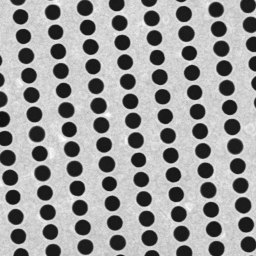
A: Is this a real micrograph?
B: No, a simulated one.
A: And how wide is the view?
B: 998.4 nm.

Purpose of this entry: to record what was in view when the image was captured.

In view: a regular array of holes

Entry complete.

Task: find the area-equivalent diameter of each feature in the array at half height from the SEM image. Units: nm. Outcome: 61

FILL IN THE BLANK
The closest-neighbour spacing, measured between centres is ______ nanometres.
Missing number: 76.7